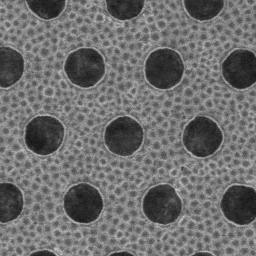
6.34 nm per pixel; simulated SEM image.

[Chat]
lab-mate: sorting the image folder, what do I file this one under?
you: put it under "holes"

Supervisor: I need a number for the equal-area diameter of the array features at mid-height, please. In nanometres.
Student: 258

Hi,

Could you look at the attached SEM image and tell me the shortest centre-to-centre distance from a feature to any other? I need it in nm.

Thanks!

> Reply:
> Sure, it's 498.